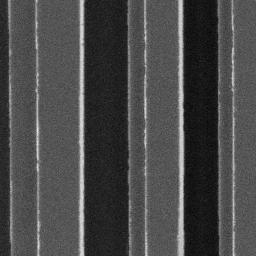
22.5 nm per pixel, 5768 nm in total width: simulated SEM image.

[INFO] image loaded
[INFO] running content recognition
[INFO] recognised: lines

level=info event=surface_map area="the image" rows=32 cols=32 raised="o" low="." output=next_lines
.ooooooooo......ooooooo....ooooo
.ooooooooo......ooooooo....ooooo
.ooooooooo......ooooooo....ooooo
.ooooooooo......ooooooo....ooooo
.ooooooooo......ooooooo....ooooo
.ooooooooo......ooooooo....ooooo
.ooooooooo......ooooooo....ooooo
.ooooooooo......ooooooo....ooooo
.ooooooooo......ooooooo....ooooo
.ooooooooo......ooooooo....ooooo
.ooooooooo......ooooooo....ooooo
.ooooooooo......ooooooo....ooooo
.ooooooooo......ooooooo....ooooo
.ooooooooo......ooooooo....ooooo
.ooooooooo......ooooooo....ooooo
.ooooooooo......ooooooo....ooooo
.ooooooooo......ooooooo....ooooo
.ooooooooo......ooooooo....ooooo
.ooooooooo......ooooooo....ooooo
.ooooooooo......ooooooo....ooooo
.ooooooooo......ooooooo....ooooo
.ooooooooo......ooooooo....ooooo
.ooooooooo......ooooooo....ooooo
.ooooooooo......ooooooo....ooooo
.ooooooooo......ooooooo....ooooo
.ooooooooo......ooooooo....ooooo
.ooooooooo......ooooooo....ooooo
.ooooooooo......ooooooo....ooooo
.ooooooooo......ooooooo....ooooo
.ooooooooo......ooooooo....ooooo
.ooooooooo......ooooooo....ooooo
.ooooooooo......ooooooo....ooooo